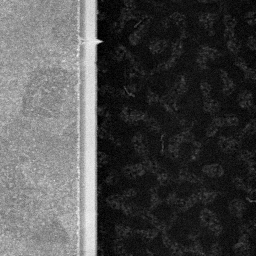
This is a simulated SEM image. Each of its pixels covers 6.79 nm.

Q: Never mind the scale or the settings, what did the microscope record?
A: one or a few lines or trenches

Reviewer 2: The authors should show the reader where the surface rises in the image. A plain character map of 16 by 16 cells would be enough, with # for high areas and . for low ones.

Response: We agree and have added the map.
######..........
######..........
######..........
######..........
######..........
######..........
######..........
######..........
######..........
######..........
######..........
######..........
######..........
######..........
######..........
######..........